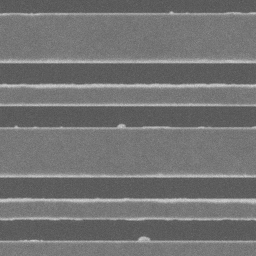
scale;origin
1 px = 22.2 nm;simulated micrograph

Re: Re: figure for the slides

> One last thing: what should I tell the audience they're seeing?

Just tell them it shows lines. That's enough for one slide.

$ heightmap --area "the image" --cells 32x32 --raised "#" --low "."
................................
................................
################################
################################
################################
################################
################################
################################
................................
................................
................................
################################
################################
................................
................................
................................
################################
################################
################################
################################
################################
################################
................................
................................
................................
################################
################################
................................
................................
................................
################################
################################